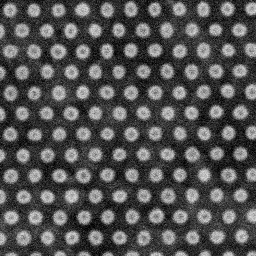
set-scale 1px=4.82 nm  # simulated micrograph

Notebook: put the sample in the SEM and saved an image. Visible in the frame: a regular array of raised bodies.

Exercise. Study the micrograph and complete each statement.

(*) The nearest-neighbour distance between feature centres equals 114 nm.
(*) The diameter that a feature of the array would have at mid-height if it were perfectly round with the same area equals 57.1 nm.